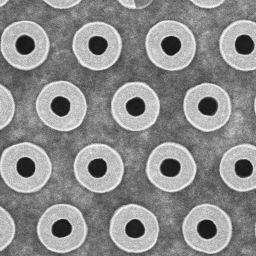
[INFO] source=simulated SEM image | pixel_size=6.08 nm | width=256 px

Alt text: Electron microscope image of a regular array of ring-shaped raised bodies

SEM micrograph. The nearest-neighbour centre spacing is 70.1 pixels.